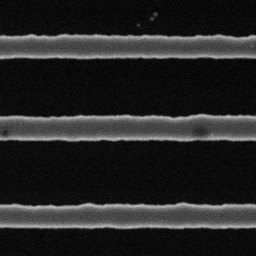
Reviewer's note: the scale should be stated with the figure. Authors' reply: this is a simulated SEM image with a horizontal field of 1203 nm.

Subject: lines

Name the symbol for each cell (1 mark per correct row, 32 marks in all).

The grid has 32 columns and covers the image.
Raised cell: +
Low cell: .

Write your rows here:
................................
................................
................................
................................
...++..++++++.....+........+...+
++++++++++++++++++++++++++++++++
++++++++++++++++++++++++++++++++
................................
................................
................................
................................
................................
................................
................................
...............++.......++......
++++++++++++++++++++++++++++++++
++++++++++++++++++++++++++++++++
....+++.+++++++......++++...++++
................................
................................
................................
................................
................................
................................
................................
......................++........
++++++++++++++++++++++++++++++++
++++++++++++++++++++++++++++++++
...............+......+....+....
................................
................................
................................